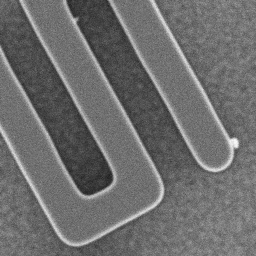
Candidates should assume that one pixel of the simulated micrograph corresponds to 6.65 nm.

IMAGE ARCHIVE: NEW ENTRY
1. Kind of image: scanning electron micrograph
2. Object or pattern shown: groups of lines, slits or small figures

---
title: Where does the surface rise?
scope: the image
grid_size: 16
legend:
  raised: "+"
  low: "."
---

.+++...+++......
..+++...++......
..+++...+++.....
...+++...++.....
+...++...+++....
+...+++...+++...
++...+++..+++...
++...+++...+++..
+++...+++..+++..
.+++..+++...+++.
.+++...+++...+..
..+++..+++......
..++++++++......
...++++++.......
....+++.........
................